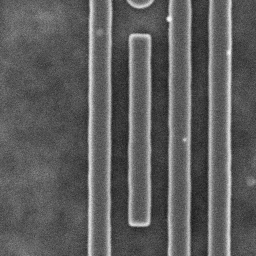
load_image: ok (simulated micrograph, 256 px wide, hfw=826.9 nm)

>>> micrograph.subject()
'groups of lines, slits or small figures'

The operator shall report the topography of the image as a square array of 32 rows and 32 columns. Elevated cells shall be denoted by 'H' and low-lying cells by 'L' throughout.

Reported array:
LLLLLLLLLLLHHHLLHHHLLHHHLLHHHLLL
LLLLLLLLLLLHHHLLLLLLLHHHLLHHHLLL
LLLLLLLLLLLHHHLLLLLLLHHHLLHHHLLL
LLLLLLLLLLLHHHLLLLLLLHHHLLHHHLLL
LLLLLLLLLLLHHHLLLHLLLHHHLLHHHLLL
LLLLLLLLLLLHHHLLHHHLLHHHLLHHHLLL
LLLLLLLLLLLHHHLLHHHLLHHHLLHHHLLL
LLLLLLLLLLLHHHLLHHHLLHHHLLHHHLLL
LLLLLLLLLLLHHHLLHHHLLHHHLLHHHLLL
LLLLLLLLLLLHHHLLHHHLLHHHLLHHHLLL
LLLLLLLLLLLHHHLLHHHLLHHHLLHHHLLL
LLLLLLLLLLLHHHLLHHHLLHHHLLHHHLLL
LLLLLLLLLLLHHHLLHHHLLHHHLLHHHLLL
LLLLLLLLLLLHHHLLHHHLLHHHLLHHHLLL
LLLLLLLLLLLHHHLLHHHLLHHHLLHHHLLL
LLLLLLLLLLLHHHLLHHHLLHHHLLHHHLLL
LLLLLLLLLLLHHHLLHHHLLHHHLLHHHLLL
LLLLLLLLLLLHHHLLHHHLLHHHLLHHHLLL
LLLLLLLLLLLHHHLLHHHLLHHHLLHHHLLL
LLLLLLLLLLLHHHLLHHHLLHHHLLHHHLLL
LLLLLLLLLLLHHHLLHHHLLHHHLLHHHLLL
LLLLLLLLLLLHHHLLHHHLLHHHLLHHHLLL
LLLLLLLLLLLHHHLLHHHLLHHHLLHHHLLL
LLLLLLLLLLLHHHLLHHHLLHHHLLHHHLLL
LLLLLLLLLLLHHHLLHHHLLHHHLLHHHLLL
LLLLLLLLLLLHHHLLHHHLLHHHLLHHHLLL
LLLLLLLLLLLHHHLLHHHLLHHHLLHHHLLL
LLLLLLLLLLLHHHLLHHHLLHHHLLHHHLLL
LLLLLLLLLLLHHHLLLLLLLHHHLLHHHLLL
LLLLLLLLLLLHHHLLLLLLLHHHLLHHHLLL
LLLLLLLLLLLHHHLLLLLLLHHHLLHHHLLL
LLLLLLLLLLLHHHLLLLLLLHHHLLHHHLLL